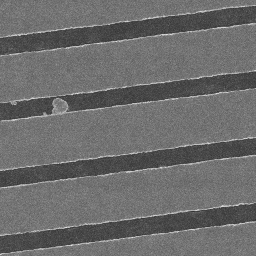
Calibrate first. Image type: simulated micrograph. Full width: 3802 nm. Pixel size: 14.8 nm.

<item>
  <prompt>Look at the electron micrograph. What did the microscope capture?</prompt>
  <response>one or a few lines or trenches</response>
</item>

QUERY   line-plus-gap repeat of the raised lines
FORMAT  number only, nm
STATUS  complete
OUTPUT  974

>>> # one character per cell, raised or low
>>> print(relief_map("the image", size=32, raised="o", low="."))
oooooooooooooooooooooooooooooooo
ooooooooooooooooooooooooo.......
oooooooooooooooooo..............
oooooooooo.................ooooo
o..................ooooooooooooo
............oooooooooooooooooooo
....oooooooooooooooooooooooooooo
oooooooooooooooooooooooooooooooo
oooooooooooooooooooooooooooooooo
ooooooooooooooooooooooooooo.....
ooooooooooooooooooo.............
oooooooooooo................oooo
ooo....o............oooooooooooo
.......o.....ooooooooooooooooooo
.....ooooooooooooooooooooooooooo
oooooooooooooooooooooooooooooooo
oooooooooooooooooooooooooooooooo
ooooooooooooooooooooooooooooo...
oooooooooooooooooooooo..........
oooooooooooooo.................o
ooooooo................ooooooooo
...............ooooooooooooooooo
.......ooooooooooooooooooooooooo
oooooooooooooooooooooooooooooooo
oooooooooooooooooooooooooooooooo
ooooooooooooooooooooooooooooooo.
ooooooooooooooooooooooooo.......
oooooooooooooooo................
ooooooooo................ooooooo
..................oooooooooooooo
..........oooooooooooooooooooooo
..oooooooooooooooooooooooooooooo